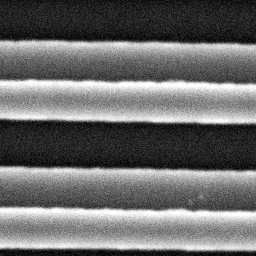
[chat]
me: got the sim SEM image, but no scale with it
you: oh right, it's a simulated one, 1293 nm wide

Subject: lines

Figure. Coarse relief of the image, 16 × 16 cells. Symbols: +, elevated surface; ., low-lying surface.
................
................
................
++++++++++++++++
++++++++++++++++
++++++++++++++++
++++++++++++++++
.......+++++++++
................
................
................
++++++++++++++++
++++++++++++++++
++++++++++++++++
++++++++++++++++
.......+++++++++